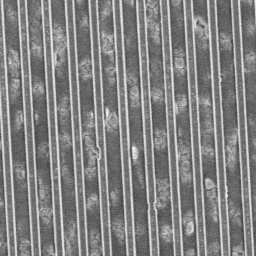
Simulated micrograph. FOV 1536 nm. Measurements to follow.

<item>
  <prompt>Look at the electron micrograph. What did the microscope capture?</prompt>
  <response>parallel lines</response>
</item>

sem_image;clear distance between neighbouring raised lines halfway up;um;0.0928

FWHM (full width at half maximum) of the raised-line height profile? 0.0464 micrometres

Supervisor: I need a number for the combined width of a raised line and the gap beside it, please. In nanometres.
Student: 142